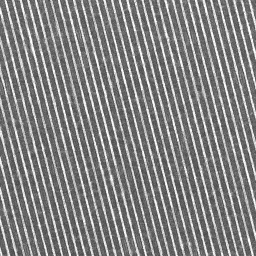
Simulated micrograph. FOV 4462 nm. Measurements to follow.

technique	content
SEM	parallel lines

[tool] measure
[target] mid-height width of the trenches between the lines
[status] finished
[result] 106 nm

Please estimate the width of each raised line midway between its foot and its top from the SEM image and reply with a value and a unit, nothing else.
25.3 nanometers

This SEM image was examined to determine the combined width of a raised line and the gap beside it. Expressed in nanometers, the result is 129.